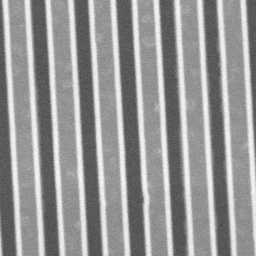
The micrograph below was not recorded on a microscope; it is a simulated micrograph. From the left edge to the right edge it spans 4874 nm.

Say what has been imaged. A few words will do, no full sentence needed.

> parallel lines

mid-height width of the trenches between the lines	0.38	um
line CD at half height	437	nanometres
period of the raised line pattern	818	nm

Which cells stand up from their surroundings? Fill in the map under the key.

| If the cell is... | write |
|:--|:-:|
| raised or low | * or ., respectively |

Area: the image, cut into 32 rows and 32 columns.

.**...***..***...***..***...**..
.**...***..***...***..***...**..
.***..***..***...***..***...***.
.***..***...**...***..***...***.
.***..***...**...***..***...***.
.***..***...**...***..***...***.
.***..***...***..***..***...***.
.***..***...***..***...**...***.
.***..***...***..***...**...***.
.***...**...***..***...**...***.
.***...**...***..***...***..***.
.***...***..***..***...***..***.
.***...***..***..***...***..***.
.***...***..***..***...***..***.
.***...***..***...**...***..***.
..**...***..***...**...***..***.
..**...***..***...**...***..***.
..**...***..***...***..***..***.
..**...***..***...***..***...**.
..**...***..***...***..***...***
..***..***...**...***..***...***
..***..***...**...***..***...***
..***..***...**...***..***...***
..***..***...**...***..***...***
..***..***...***..***...**...***
..***..***...***..***...**...***
..***..***...***..***...**...***
..***...**...***..***...**...***
..***...***..***..***...***..***
..***...**...***..***...***..***
..***...**...***...**...***..***
..***...***..***...**...***..***